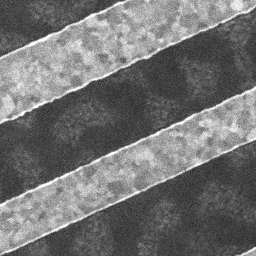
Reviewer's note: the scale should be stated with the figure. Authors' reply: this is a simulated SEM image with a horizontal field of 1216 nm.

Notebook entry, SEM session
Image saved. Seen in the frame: one or a few lines or trenches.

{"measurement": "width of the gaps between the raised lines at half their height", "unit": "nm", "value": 350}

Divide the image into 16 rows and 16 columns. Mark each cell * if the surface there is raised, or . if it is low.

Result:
.......*********
.....*********..
...********.....
*********.......
*******.........
*****...........
***...........**
*...........****
.........*******
.......*******..
.....*******....
...*******......
.*******........
*****...........
***.............
*...............